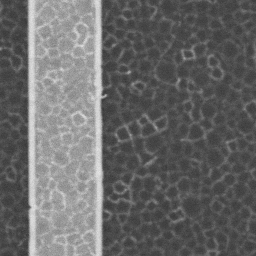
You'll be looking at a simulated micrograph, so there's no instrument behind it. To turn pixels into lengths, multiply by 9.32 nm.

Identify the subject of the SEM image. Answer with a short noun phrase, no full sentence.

one or a few lines or trenches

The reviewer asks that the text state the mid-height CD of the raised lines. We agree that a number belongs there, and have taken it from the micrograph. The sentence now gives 66.7 px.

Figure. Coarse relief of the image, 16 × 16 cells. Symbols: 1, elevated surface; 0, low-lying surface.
0011110000000000
0011110000000000
0011110000000000
0011110000000000
0011110000000000
0011110000000000
0011110000000000
0011110000000000
0011110000000000
0011110000000000
0011110000000000
0011110000000000
0011110000000000
0011110000000000
0011110000000000
0011110000000000